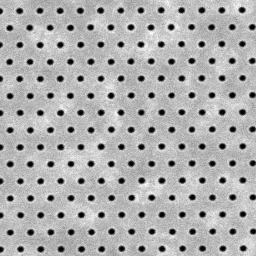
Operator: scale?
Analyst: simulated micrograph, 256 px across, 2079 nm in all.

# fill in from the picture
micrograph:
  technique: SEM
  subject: a regular array of holes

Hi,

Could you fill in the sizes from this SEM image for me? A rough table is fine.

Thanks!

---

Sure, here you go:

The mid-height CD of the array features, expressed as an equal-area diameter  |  55 nm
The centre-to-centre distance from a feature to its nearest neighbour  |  158 nanometres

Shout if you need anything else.